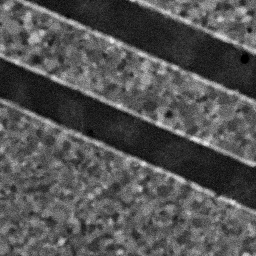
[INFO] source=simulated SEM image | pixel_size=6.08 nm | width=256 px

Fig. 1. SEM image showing one or a few lines or trenches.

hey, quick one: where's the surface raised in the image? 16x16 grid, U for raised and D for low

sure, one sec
UUDDDDDDDDUUUUUU
UUUUUDDDDDDDUUUU
UUUUUUUDDDDDDDUU
UUUUUUUUUDDDDDDD
DDUUUUUUUUUUDDDD
DDDDDUUUUUUUUUDD
UDDDDDDUUUUUUUUU
UUUDDDDDDUUUUUUU
UUUUUDDDDDDDUUUU
UUUUUUUDDDDDDDUU
UUUUUUUUUUDDDDDD
UUUUUUUUUUUUDDDD
UUUUUUUUUUUUUUDD
UUUUUUUUUUUUUUUU
UUUUUUUUUUUUUUUU
UUUUUUUUUUUUUUUU